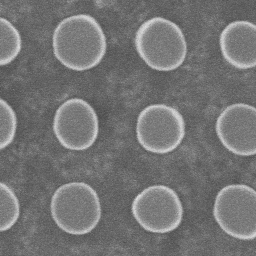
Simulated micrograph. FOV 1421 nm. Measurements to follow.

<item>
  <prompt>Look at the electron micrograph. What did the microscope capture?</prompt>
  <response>raised bodies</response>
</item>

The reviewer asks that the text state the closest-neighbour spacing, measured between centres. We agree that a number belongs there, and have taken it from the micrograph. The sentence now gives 455 nm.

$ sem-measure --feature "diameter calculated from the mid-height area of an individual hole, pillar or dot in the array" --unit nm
270